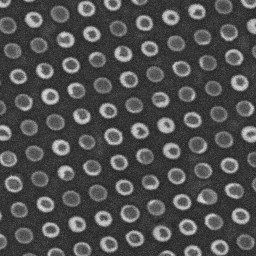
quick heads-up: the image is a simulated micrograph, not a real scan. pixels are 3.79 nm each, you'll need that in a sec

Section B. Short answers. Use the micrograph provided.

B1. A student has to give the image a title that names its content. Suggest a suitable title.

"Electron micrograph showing a regular array of raised bodies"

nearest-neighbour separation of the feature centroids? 98.4 nanometres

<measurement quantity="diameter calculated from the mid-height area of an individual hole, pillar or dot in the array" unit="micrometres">0.0615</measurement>